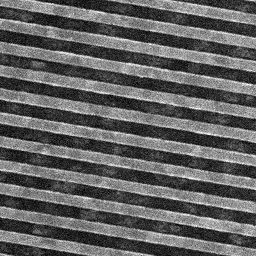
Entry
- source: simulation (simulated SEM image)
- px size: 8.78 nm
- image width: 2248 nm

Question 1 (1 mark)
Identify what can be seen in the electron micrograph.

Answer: parallel lines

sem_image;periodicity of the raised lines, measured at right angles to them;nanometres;203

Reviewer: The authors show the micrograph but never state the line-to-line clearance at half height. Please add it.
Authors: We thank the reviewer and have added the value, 110 nm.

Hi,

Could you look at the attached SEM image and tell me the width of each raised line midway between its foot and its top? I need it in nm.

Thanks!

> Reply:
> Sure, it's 93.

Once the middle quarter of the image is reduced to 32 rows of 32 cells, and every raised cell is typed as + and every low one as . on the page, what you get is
....++++++++++++++++............
..........++++++++++++++++......
................++++++++++++++++
+++...................++++++++++
+++++++++...................++++
+++++++++++++++.................
.....++++++++++++++++...........
...........+++++++++++++++......
.................+++++++++++++++
++++....................++++++++
++++++++++...................+++
+++++++++++++++.................
......+++++++++++++++...........
............+++++++++++++++.....
..................++++++++++++++
+++.....................++++++++
+++++++++.....................++
.++++++++++++++.................
.......++++++++++++++...........
.............++++++++++++++.....
..................++++++++++++++
++++.....................+++++++
++++++++++.....................+
..++++++++++++++................
......++++++++++++++++..........
..............++++++++++++++....
...................+++++++++++++
+++++.....................++++++
+++++++++++.....................
...++++++++++++++...............
........+++++++++++++++.........
...............+++++++++++++....